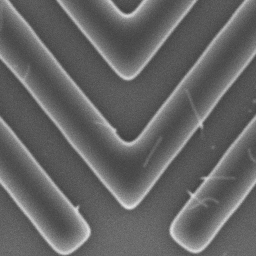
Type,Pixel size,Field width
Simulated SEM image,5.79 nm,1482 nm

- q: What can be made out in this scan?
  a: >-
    groups of lines, slits or small figures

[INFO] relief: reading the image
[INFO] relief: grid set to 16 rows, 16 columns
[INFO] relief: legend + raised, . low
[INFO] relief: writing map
+...+++..+++...+
++...++++++...++
++....++++...+++
+++...++++...+++
.+++...++...+++.
..+++......+++..
..++++....+++...
...++++...+++...
+...+++..+++...+
++...++++++...++
+++...++++...+++
+++....+++...+++
.+++...++...+++.
..+++......+++..
...++......+++..
...++.......+...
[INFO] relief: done